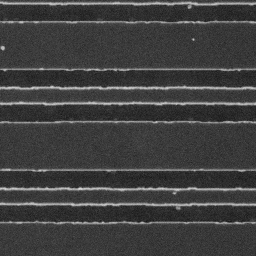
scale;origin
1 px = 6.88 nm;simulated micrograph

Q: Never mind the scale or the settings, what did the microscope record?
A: lines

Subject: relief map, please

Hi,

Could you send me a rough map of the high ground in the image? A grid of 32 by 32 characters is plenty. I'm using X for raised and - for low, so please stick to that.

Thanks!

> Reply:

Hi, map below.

-------------------------X------
--------------------------------
--------------------------------
XXXXXXXXXXXXXXXXXXXXXXXXXXXXXXXX
XXXXXXXXXXXXXXXXXXXXXXXXXXXXXXXX
XXXXXXXXXXXXXXXXXXXXXXXXXXXXXXXX
XXXXXXXXXXXXXXXXXXXXXXXXXXXXXXXX
XXXXXXXXXXXXXXXXXXXXXXXXXXXXXXXX
XXXXXXXXXXXXXXXXXXXXXXXXXXXXXXXX
--------------------------------
--------------------------------
XXXXXXXXXXXXXXXXXXXXXXXXXXXXXXXX
XXXXXXXXXXXXXXXXXXXXXXXXXXXXXXXX
--------------------------------
--------------------------------
XXXXXXXXXXXXXXXXXXXXXXXXXXXXXXXX
XXXXXXXXXXXXXXXXXXXXXXXXXXXXXXXX
XXXXXXXXXXXXXXXXXXXXXXXXXXXXXXXX
XXXXXXXXXXXXXXXXXXXXXXXXXXXXXXXX
XXXXXXXXXXXXXXXXXXXXXXXXXXXXXXXX
XXXXXXXXXXXXXXXXXXXXXXXXXXXXXXXX
--------------------------------
--------------------------------
--------------------------------
XXXXXXXXXXXXXXXXXXXXXXXXXXXXXXXX
XXX-XXXXXXXXXXXXXXXXXXXXXXXXXXXX
--------------------------------
--------------------------------
XXXXXXXXXXXXXXXXXXXXXXXXXXXXXXXX
XXXXXXXXXXXXXXXXXXXXXXXXXXXXXXXX
XXXXXXXXXXXXXXXXXXXXXXXXXXXXXXXX
XXXXXXXXXXXXXXXXXXXXXXXXXXXXXXXX